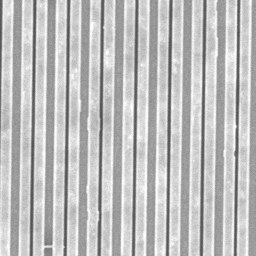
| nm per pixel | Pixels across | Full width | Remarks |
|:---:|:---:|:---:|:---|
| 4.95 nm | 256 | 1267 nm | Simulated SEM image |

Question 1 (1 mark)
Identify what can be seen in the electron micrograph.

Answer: parallel lines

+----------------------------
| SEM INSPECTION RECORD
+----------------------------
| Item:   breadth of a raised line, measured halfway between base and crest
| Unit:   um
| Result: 0.0519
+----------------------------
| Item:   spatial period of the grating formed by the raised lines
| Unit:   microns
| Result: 0.0834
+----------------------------